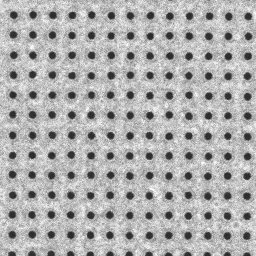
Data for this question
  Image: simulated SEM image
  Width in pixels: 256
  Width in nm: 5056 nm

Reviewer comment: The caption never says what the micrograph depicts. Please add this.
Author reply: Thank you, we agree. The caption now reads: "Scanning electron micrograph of a regular array of holes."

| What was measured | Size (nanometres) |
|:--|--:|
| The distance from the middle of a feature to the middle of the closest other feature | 381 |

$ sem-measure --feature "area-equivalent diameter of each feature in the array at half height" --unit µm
0.162